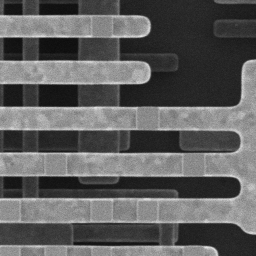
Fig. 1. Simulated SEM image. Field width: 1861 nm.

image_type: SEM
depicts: wiring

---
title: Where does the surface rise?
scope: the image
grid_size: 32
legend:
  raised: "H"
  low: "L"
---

LLLLLLLLLLLLLLLLLLLLLLLLLLLLLLLL
LLLLLLLLLLLLLLLLLLLLLLLLLLLLLLLL
HHHHHHHHHHHHHHHHHHHLLLLLLLLLLLLL
HHHHHHHHHHHHHHHHHHHLLLLLLLLLLLLL
HHHHHHHHHHHHHHHHHHLLLLLLLLLLLLLL
LLLLLLLLLLLLLLLLLLLLLLLLLLLLLLLL
LLLLLLLLLLLLLLLLLLLLLLLLLLLLLLLL
LLLLLLLLLLLLLLLLLLLLLLLLLLLLLLLL
HHHHHHHHHHHHHHHHHHHLLLLLLLLLLLHH
HHHHHHHHHHHHHHHHHHHLLLLLLLLLLLHH
LLLLLLLLLLLLLLLLLLLLLLLLLLLLLLHH
LLLLLLLLLLLLLLLLLLLLLLLLLLLLLLHH
LLLLLLLLLLLLLLLLLLLLLLLLLLLLLLHH
HHHHHHHHHHHHHHHHHHHHHHHHHHHHHHHH
HHHHHHHHHHHHHHHHHHHHHHHHHHHHHHHH
HHHHHHHHHHHHHHHHHHHHHHHHHHHHHHHH
LLLLLLLLLLLLLLLLLLLLLLLLLLLLLHHH
LLLLLLLLLLLLLLLLLLLLLLLLLLLLLLHH
LLLLLLLLLLLLLLLLLLLLLLLLLLLLLLHH
HHHHHHHHHHHHHHHHHHHHHHHHHHHHHHHH
HHHHHHHHHHHHHHHHHHHHHHHHHHHHHHHH
HHHHHHHHHHHHHHHHHHHHHHHHHHHHHHHH
LLLLLLLLLLLLLLLLLLLLLLLLLLLLLLHH
LLLLLLLLLLLLLLLLLLLLLLLLLLLLLLHH
LLLLLLLLLLLLLLLLLLLLLLLLLLLLLLHH
HHHHHHHHHHHHHHHHHHHHHHHHHHHHHHHH
HHHHHHHHHHHHHHHHHHHHHHHHHHHHHHHH
HHHHHHHHHHHHHHHHHHHHHHHHHHHHHHHH
LLLLLLLLLLLLLLLLLLLLLLLLLLLLLLHH
LLLLLLLLLLLLLLLLLLLLLLLLLLLLLLLL
LLLLLLLLLLLLLLLLLLLLLLLLLLLLLLLL
HHHHHHHHHHHHHHHHHHHHHHHHHHHLLLLL